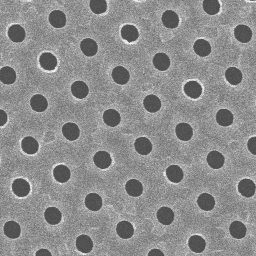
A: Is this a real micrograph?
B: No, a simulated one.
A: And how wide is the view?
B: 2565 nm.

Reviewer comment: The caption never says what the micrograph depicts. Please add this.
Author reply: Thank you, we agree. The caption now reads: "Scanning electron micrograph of a regular array of holes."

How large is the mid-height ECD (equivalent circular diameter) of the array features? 183 nm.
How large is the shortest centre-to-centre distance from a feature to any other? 42.2 pixels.